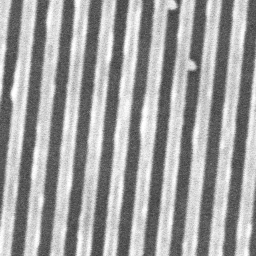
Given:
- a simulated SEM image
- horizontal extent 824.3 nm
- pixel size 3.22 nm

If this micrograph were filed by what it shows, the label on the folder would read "parallel lines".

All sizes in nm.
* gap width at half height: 42.4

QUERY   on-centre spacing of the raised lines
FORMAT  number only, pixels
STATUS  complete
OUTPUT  26.3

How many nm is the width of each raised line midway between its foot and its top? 42.4